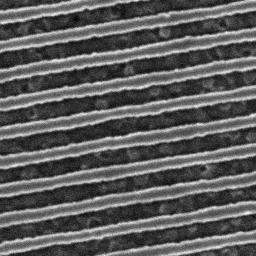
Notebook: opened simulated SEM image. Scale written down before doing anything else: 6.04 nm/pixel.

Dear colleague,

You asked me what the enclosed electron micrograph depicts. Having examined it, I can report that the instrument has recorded parallel lines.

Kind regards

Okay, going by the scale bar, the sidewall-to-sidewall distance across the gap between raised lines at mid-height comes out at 105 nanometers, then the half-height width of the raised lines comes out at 66.3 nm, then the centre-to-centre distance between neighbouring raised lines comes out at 28.5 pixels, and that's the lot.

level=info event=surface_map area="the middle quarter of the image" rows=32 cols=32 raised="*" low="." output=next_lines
*******.........................
*...........................****
.....................***********
................****************
..........*****************.....
...******************...........
**************..................
*********.......................
.............................***
.......................*********
...................*************
...........***************......
....*******************.........
*************...................
*********.......................
****..........................**
.........................*******
.................***************
...........*********************
......******************........
.***************................
*********.......................
****............................
..........................******
.....................***********
............******************..
.......****************.........
.*****************..............
**************..................
*******.........................
...........................*****
....................************